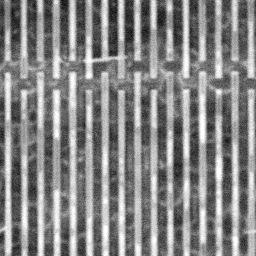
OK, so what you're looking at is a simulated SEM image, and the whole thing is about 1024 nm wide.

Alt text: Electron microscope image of parallel lines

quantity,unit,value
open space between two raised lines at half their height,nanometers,43.5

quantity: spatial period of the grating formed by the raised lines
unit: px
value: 16.2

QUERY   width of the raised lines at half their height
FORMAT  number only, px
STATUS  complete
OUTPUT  5.38